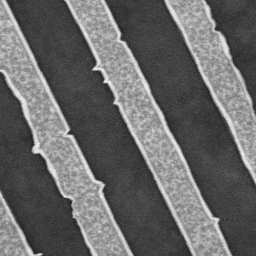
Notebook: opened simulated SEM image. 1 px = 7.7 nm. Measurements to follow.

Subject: one or a few lines or trenches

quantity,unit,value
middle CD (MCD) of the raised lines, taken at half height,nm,242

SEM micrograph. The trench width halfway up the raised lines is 444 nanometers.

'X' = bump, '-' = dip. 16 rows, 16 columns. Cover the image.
----XXX----XX---
X----XX----XX---
X-----XX----XX--
XX----XX----XX--
XX----XXX----XX-
-XX----XX----XX-
--X----XXX----XX
--XX----XX----XX
--XX----XXX----X
--XXX----XX----X
---XX----XXX----
----XX----XX----
----XX----XXX---
X----XX----XX---
X----XX-----XX--
XX----XX----XX--